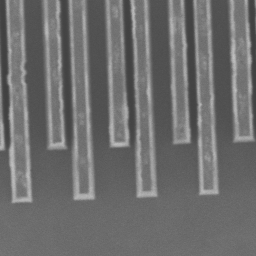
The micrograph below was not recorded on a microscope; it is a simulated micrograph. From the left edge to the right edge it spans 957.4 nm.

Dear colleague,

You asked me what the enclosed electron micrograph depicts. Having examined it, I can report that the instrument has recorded parallel lines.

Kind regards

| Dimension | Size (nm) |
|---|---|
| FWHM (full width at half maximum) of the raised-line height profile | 68.2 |